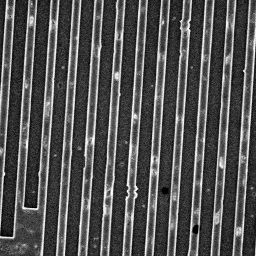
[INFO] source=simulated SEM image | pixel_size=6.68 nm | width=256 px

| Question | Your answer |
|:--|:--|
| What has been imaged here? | parallel lines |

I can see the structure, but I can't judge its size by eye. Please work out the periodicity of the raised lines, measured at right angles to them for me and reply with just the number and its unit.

147 nanometres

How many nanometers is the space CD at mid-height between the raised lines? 88.2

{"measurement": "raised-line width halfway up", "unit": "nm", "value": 58.3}